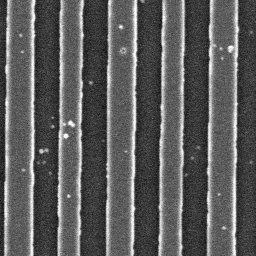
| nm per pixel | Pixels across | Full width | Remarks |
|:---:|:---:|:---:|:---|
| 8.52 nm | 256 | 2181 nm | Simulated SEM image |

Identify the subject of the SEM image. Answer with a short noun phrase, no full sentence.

lines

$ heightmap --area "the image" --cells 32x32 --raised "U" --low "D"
DUUUDDDDUUDDDDUUUDDDUUUDDDUUUUDD
DUUUDDDDUUDDDDUUUDDDUUUDDDUUUUDD
DUUUDDDDUUDDDDUUUDDDUUUDDDUUUUDD
DUUUDDDDUUDDDDUUUDDDUUUDDDUUUUDD
DUUUDDDDUUDDDDUUUDDDUUUDDDUUUUDD
DUUUDDDDUUDDDDUUUDDDUUUDDDUUUUDD
DUUUDDDDUUDDDDUUUDDDUUUDDDUUUUDD
DUUUDDDDUUDDDDUUUDDDUUUDDDUUUUDD
DUUUDDDDUUDDDUUUUDDDUUUDDDUUUUDD
DUUUDDDDUUDDDUUUUDDDUUUDDDUUUDDD
DUUUDDDDUUDDDUUUUDDDUUUDDDUUUDDD
DUUUDDDDUUDDDUUUUDDDUUUDDDUUUDDD
DUUUDDDDUUDDDUUUUDDDUUUDDDUUUUDD
DUUUDDDUUUDDDUUUUDDDUUUDDDUUUDDD
DUUUDDDDUUDDDUUUUDDDUUUDDDUUUDDD
DUUUDDDDUUDDDUUUUDDDUUUDDDUUUDDD
DUUUDDDUUUDDDUUUUDDDUUUDDDUUUDDD
DUUUDDDUUUDDDUUUUDDDUUUDDDUUUDDD
DUUUDDDUUUDDDUUUUDDDUUUDDDUUUDDD
DUUUDDDUUUDDDUUUUDDDUUUDDDUUUDDD
DUUUDDDUUUDDDUUUUDDDUUUDDDUUUDDD
DUUUDDDUUUDDDUUUUDDDUUUDDDUUUDDD
DUUUDDDUUUDDDUUUUDDDUUUDDDUUUDDD
DUUUDDDUUUDDDUUUUDDDUUUDDDUUUDDD
DUUUDDDUUUDDDUUUUDDDUUUDDDUUUDDD
DUUUDDDUUUDDDUUUUDDDUUUDDDUUUDDD
DUUUDDDUUUDDDUUUUDDDUUUDDDUUUDDD
DUUUDDDUUUDDDUUUUDDDUUUDDDUUUDDD
DUUUDDDUUUDDDUUUUDDDUUUDDDUUUDDD
DUUUDDDUUUDDDUUUUDDDUUUDDDUUUDDD
DUUUDDDUUUDDDUUUUDDDUUUDDDUUUDDD
DUUUDDDUUUDDDUUUUDDDUUUDDDUUUDDD